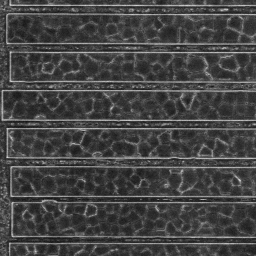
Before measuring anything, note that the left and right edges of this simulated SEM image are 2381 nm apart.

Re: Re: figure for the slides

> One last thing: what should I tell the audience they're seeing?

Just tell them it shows parallel lines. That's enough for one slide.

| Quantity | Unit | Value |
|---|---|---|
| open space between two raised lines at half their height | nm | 69.7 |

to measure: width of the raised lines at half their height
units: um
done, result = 0.28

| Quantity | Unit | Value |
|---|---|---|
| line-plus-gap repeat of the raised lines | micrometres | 0.354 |